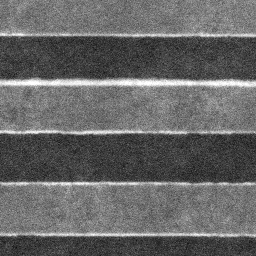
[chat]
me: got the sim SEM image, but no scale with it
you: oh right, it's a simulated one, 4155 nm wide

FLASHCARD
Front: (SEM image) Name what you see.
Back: lines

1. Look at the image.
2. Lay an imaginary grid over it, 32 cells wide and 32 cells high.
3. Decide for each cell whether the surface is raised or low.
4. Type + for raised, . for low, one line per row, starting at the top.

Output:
++++++++++++++++++++++++++++++++
++++++++++++++++++++++++++++++++
++++++++++++++++++++++++++++++++
++++++++++++++++++++++++++++++++
................................
................................
................................
................................
................................
................................
................................
++++++++++++++++++++++++++++++++
++++++++++++++++++++++++++++++++
++++++++++++++++++++++++++++++++
++++++++++++++++++++++++++++++++
++++++++++++++++++++++++++++++++
+++++.+++++.....++++++++++++++++
................................
................................
................................
................................
................................
................................
++++++++++++++++++++++++++++++++
++++++++++++++++++++++++++++++++
++++++++++++++++++++++++++++++++
++++++++++++++++++++++++++++++++
++++++++++++++++++++++++++++++++
++++++++++++++++++++++++++++++++
................................
................................
................................